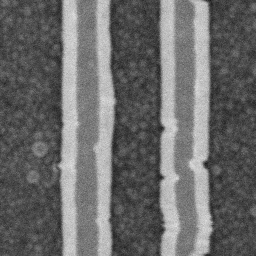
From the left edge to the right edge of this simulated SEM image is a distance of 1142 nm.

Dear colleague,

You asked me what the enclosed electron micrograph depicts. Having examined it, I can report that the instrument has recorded one or a few lines or trenches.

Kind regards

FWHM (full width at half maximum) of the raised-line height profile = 155 nanometers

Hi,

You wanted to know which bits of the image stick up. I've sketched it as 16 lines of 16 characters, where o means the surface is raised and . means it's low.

....oo....ooo...
....oo....ooo...
....oo....ooo...
....oo....ooo...
....ooo....oo...
....ooo....oo...
....ooo....oo...
....ooo...ooo...
....ooo....oo...
....ooo...ooo...
....oo....oo....
....ooo....oo...
....ooo...ooo...
....oo.....oo...
....ooo....oo...
....ooo...ooo...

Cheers